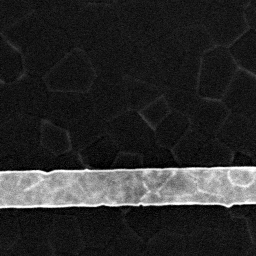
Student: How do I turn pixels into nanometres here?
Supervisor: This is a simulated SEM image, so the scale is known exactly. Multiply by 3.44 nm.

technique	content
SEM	one or a few lines or trenches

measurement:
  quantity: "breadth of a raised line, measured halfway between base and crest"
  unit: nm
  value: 121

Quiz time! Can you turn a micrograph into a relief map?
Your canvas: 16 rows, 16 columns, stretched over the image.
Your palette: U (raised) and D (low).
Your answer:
DDDDDDDDDDDDDDDD
DDDDDDDDDDDDDDDD
DDDDDDDDDDDDDDDD
DDDDDDDDDDDDDDDD
DDDDDDDDDDDDDDDD
DDDDDDDDDDDDDDDD
DDDDDDDDDDDDDDDD
DDDDDDDDDDDDDDDD
DDDDDDDDDDDDDDDD
DDDDDDDDDDDDDDDD
DDDDDDDDDDDDDDDU
UUUUUUUUUUUUUUUU
UUUUUUUUUUUUUUUU
DDDDDDDDDDDDDDDD
DDDDDDDDDDDDDDDD
DDDDDDDDDDDDDDDD